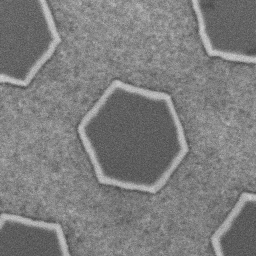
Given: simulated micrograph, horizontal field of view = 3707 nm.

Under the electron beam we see raised bodies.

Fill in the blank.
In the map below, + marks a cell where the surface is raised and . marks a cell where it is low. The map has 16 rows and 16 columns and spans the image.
+++.........++++
+++..........+++
+++..........+++
+++...........++
++..............
.......+........
......+++++.....
.....++++++.....
.....++++++.....
......+++++.....
......+++++.....
.......+++......
...............+
..............++
++++..........++
++++..........++